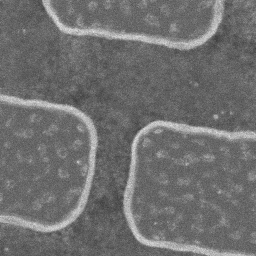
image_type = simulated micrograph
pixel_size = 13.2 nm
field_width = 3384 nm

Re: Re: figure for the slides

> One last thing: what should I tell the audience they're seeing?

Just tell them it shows raised bodies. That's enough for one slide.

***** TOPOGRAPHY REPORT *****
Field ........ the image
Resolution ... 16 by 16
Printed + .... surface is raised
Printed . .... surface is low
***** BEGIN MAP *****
...+++++++++++..
....+++++++++...
.........++++...
................
................
................
+++.............
+++++...........
++++++...+++++++
++++++..++++++++
++++++..++++++++
+++++...++++++++
+++++...++++++++
+++++...++++++++
........++++++++
...........+++++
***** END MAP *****